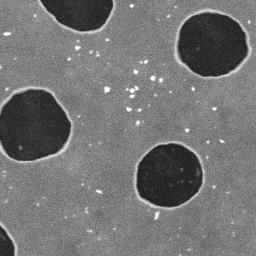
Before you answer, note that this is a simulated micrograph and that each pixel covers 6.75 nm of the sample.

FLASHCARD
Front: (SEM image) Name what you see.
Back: holes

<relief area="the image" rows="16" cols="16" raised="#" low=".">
###....#########
####..#####....#
###########....#
###########....#
############..##
################
....############
....############
....############
....#####...####
#########....###
#########....###
#########...####
################
################
.###############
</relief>